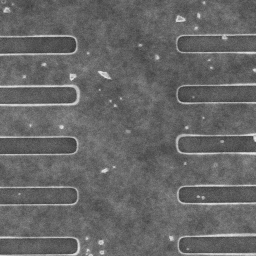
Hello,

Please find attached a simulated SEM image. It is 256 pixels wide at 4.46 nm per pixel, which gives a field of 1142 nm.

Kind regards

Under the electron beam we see groups of lines, slits or small figures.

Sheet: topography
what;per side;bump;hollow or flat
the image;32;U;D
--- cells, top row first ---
UUUUUUUUUUUUUUUUUUUUUUUUUUUUUUUU
UUUUUUUUUUUUUUUUUUUUUUUUUUUUUUUU
UUUUUUUUUUUUUUUUUUUUUUUUUUUUUUUU
UUUUUUUUUUUUUUUUUUUUUUUUUUUUUUUU
UUUUUDDDUUUUUUUUUUUUUUUDDDDDDDDD
DDDDDDDDDDUUUUUUUUUUUUDDDDDDDDDD
DDDDDDDDDUUUUUUUUUUUUUUDDDDDDDDD
UUUUUUUUUUUUUUUUUUUUUUUUUUUUUUUU
UUUUUUUUUUUUUUUUUUUUUUUUUUUUUUUU
UUUUUUUUUUUUUUUUUUUUUUUUUUUUUUUU
UUUUUUUUUUUUUUUUUUUUUUUUUUUUUUUU
DDDDDDDDDDUUUUUUUUUUUUDDDDDDDDDD
DDDDDDDDDDUUUUUUUUUUUUDDDDDDDDDD
UUUUUUUUUUUUUUUUUUUUUUUUUUUUUUUU
UUUUUUUUUUUUUUUUUUUUUUUUUUUUUUUU
UUUUUUUUUUUUUUUUUUUUUUUUUUUUUUUU
UUUUUUUUUUUUUUUUUUUUUUUUUUUUUUUU
DDDDDDDDDUUUUUUUUUUUUUDDDDDDDDDD
DDDDDDDDDDUUUUUUUUUUUUDDDDDDDDDD
UUUUUUUUUUUUUUUUUUUUUUUUUUUUUUUU
UUUUUUUUUUUUUUUUUUUUUUUUUUUUUUUU
UUUUUUUUUUUUUUUUUUUUUUUUUUUUUUUU
UUUUUUUUUUUUUUUUUUUUUUUUUUUUUUUU
DDDDDDDDDUUUUUUUUUUUUUUDDDDDDDDD
DDDDDDDDDDUUUUUUUUUUUUDDDDDDDDDD
DDDDDDDDDUUUUUUUUUUUUUUUUUUUUUUU
UUUUUUUUUUUUUUUUUUUUUUUUUUUUUUUU
UUUUUUUUUUUUUUUUUUUUUUUUUUUUUUUU
UUUUUUUUUUUUUUUUUUUUUUUUUUUUUUUU
UUUUUUUUUUUUUUUUUUUUUUUUUUDDDDDD
DDDDDDDDDDUUUUUUUUUUUUDDDDDDDDDD
DDDDDDDDDDUUUUUUUUUUUUUDDDDDDDDD